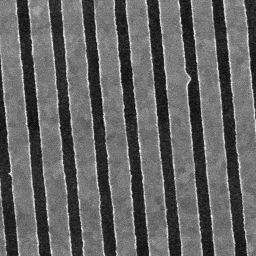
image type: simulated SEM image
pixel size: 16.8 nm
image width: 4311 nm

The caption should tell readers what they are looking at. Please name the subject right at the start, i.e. parallel lines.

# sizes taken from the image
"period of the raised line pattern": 547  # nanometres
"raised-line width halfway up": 348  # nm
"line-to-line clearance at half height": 199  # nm